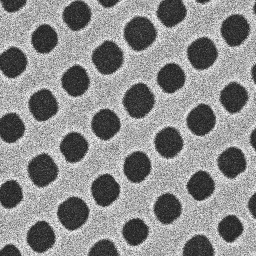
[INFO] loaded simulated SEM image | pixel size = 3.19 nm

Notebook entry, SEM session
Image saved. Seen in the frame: a regular array of holes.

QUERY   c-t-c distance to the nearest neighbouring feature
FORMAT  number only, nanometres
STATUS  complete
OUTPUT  126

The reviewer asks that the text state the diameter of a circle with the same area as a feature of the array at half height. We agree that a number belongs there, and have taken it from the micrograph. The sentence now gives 94.5 nm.